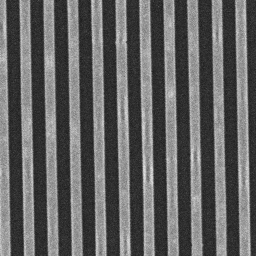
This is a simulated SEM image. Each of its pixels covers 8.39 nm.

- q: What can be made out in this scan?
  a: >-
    parallel lines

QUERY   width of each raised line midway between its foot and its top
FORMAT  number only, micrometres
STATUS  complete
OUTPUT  0.0818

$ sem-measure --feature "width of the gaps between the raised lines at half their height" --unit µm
0.114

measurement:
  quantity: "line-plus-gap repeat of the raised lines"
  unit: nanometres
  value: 201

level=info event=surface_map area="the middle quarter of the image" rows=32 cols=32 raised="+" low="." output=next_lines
.+++...+++...+++...+++...+++...+
.+++...+++...+++...+++....++...+
.+++...+++...+++...+++....++...+
.+++...+++...+++...+++....++...+
.+++...+++...+++...+++....++...+
.+++...+++...+++....++....++...+
..++...+++...+++....++....++...+
..++...+++...+++....++....++...+
..++...+++...+++....++....++...+
..++...+++...+++....++....++....
..++...+++....++....++....++....
..++...+++....++....++...+++....
..++...+++....++....++...+++....
..++...+++....++....++...+++....
.+++...+++....++....++....++....
.+++....++....++....++....++....
..++....++....++....++....++....
..++....++....++....++....++....
..++....++....++....++....++....
..++....++....++....++....++....
..++....++....++....++....++....
..++....++....++....++....++....
..++....++....++....++....++....
..++....++....++....++....++....
..++....++....++....++....++....
..++....++....++....++....++....
..++....++....++....++....++....
..++....++....++....++....++....
..++....++....++....++....++....
..++....++....++....++....++....
..++....++....++....++....++....
..++....++....++....++....++....